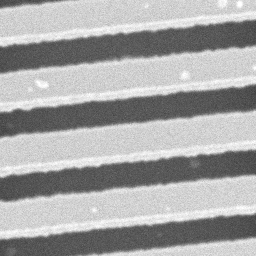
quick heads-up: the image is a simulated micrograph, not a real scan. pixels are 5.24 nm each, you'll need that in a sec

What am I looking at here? lines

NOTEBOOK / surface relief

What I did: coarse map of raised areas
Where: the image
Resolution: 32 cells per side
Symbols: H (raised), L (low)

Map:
LLLLLLHHHHHHHHHHHHHHHHHHHHHHHHHH
HHHHHHHHHHHHHHHHHHHHHHHHHHHHHHHH
HHHHHHHHHHHHHHHHHHHHHHHHHHHHHHHL
HHHHHHHHHHHHHHHHHHHHHLLLLLLLLLLL
HHHHHHHHHHHLLLLLLLLLLLLLLLLLLLLL
HLLLLLLLLLLLLLLLLLLLLLLLLLLLLLLL
LLLLLLLLLLLLLLLLLLLLLLLLLLHHHHHH
LLLLLLLLLLLLLLLHHHHHHHHHHHHHHHHH
LLLLLLLHHHHHHHHHHHHHHHHHHHHHHHHH
HHHHHHHHHHHHHHHHHHHHHHHHHHHHHHHH
HHHHHHHHHHHHHHHHHHHHHHHHHHHHHHHH
HHHHHHHHHHHHHHHHHHHHHHLLLLLLLLLL
HHHHHHHHHHHHHLLLLLLLLLLLLLLLLLLL
HHHHLLLLLLLLLLLLLLLLLLLLLLLLLLLL
LLLLLLLLLLLLLLLLLLLLLLLLLLLHHHHH
LLLLLLLLLLLLLLLLHHHHHHHHHHHHHHHH
LLLLLLLLHHHHHHHHHHHHHHHHHHHHHHHH
HHHHHHHHHHHHHHHHHHHHHHHHHHHHHHHH
HHHHHHHHHHHHHHHHHHHHHHHHHHHHHHHH
HHHHHHHHHHHHHHHHHHHHHHLLLLLLLLLL
HHHHHHHHHHHHHLLLLLLLLLLLLLLLLLLL
HHHHLLLLLLLLLLLLLLLLLLLLLLLLLLLL
LLLLLLLLLLLLLLLLLLLLLLLLLLLHHHHH
LLLLLLLLLLLLLLLLLHHHHHHHHHHHHHHH
LLLLLLLHHHHHHHHHHHHHHHHHHHHHHHHH
HHHHHHHHHHHHHHHHHHHHHHHHHHHHHHHH
HHHHHHHHHHHHHHHHHHHHHHHHHHHHHHHH
HHHHHHHHHHHHHHHHHHHHHHHLLLLLLLLL
HHHHHHHHHHHHHLLLLLLLLLLLLLLLLLLL
HHHHLLLLLLLLLLLLLLLLLLLLLLLLLLLL
LLLLLLLLLLLLLLLLLLLLLLLLLLHHHHHH
LLLLLLLLLLLLLLLLLHHHHHHHHHHHHHHH